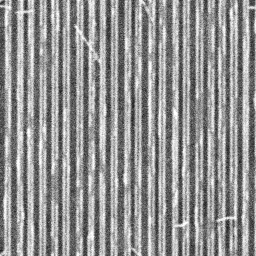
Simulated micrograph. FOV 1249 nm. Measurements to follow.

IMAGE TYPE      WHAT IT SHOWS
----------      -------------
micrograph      parallel lines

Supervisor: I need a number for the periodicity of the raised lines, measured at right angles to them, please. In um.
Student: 0.058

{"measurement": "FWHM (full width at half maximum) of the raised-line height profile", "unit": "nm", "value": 27.5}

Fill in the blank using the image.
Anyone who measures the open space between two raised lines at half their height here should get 6.37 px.